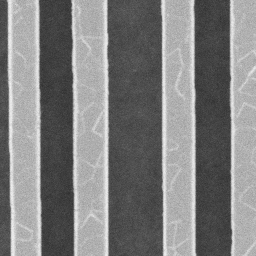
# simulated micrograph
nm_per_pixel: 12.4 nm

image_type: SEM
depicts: lines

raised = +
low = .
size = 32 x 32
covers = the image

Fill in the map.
.++++....++++.......++++.....+++
.++++....++++.......++++.....+++
.++++....++++.......++++.....+++
.++++....++++.......++++.....+++
.++++....++++.......++++.....+++
.++++....++++.......++++.....+++
.++++....++++.......++++.....+++
.++++....++++.......++++.....+++
.++++....++++.......++++.....+++
.++++....++++.......++++.....+++
.++++....++++.......++++.....+++
.++++....++++.......++++.....+++
.++++....++++.......++++.....+++
.++++....++++.......++++.....+++
.++++....++++.......++++.....+++
.++++....++++.......++++.....+++
.++++....++++.......++++.....+++
.++++....++++.......++++.....+++
.++++....++++.......++++.....+++
.++++....++++.......++++.....+++
.++++....++++.......++++.....+++
.++++....++++.......++++.....+++
.++++....++++.......++++.....+++
.++++....++++.......++++.....+++
.++++....++++.......++++.....+++
.++++....++++.......++++.....+++
.++++....++++.......++++.....+++
.++++....++++.......++++.....+++
.++++....++++.......++++.....+++
.++++....++++.......++++.....+++
.++++....++++.......++++.....+++
.++++....++++.......++++.....+++